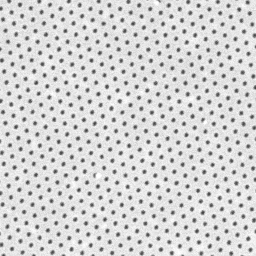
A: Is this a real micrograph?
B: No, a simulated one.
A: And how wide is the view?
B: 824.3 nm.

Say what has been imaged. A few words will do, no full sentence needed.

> a regular array of holes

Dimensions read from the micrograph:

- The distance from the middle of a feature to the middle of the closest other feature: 35.2 nm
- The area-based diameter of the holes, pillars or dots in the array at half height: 15.4 nanometers